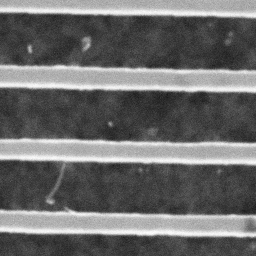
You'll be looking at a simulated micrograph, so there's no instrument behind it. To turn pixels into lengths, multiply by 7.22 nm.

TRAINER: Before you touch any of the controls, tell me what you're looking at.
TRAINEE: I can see lines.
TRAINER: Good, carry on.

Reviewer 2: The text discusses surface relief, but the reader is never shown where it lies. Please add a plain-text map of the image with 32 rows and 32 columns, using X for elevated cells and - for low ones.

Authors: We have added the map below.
XXXXXXXXXXXXXXXXXXXXXXXXXXXXXXXX
----XXXXXXXXXXXXXXXXXXXXXXXXXXXX
--------------------------------
--------------------------------
--------------------------------
--------------------------------
--------------------------------
--------------------------------
XXXXXXXXXX----------------------
XXXXXXXXXXXXXXXXXXXXXXXXXXXXXXXX
XXXXXXXXXXXXXXXXXXXXXXXXXXXXXXXX
--------------------------------
--------------------------------
--------------------------------
--------------------------------
--------------------------------
--------------------------------
--XX----------------------------
XXXXXXXXXXXXXXXXXXXXXXXXXXXXXXXX
XXXXXXXXXXXXXXXXXXXXXXXXXXXXXXXX
--------------------------------
--------------------------------
--------------------------------
--------------------------------
--------------------------------
--------------------------------
XXXXX---------------------------
XXXXXXXXXXXXXXXXXXXXXXXXXXXXXXXX
XXXXXXXXXXXXXXXXXXXXXXXXXXXXXXXX
------------------------------X-
--------------------------------
--------------------------------